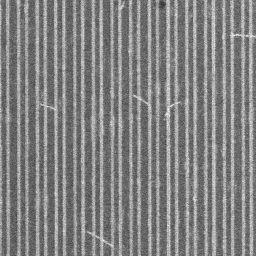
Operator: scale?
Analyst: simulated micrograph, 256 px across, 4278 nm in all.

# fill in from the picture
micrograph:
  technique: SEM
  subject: parallel lines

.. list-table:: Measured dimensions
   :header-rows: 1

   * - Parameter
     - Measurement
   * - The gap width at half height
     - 0.0982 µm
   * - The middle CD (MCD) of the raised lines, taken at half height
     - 37.6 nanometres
